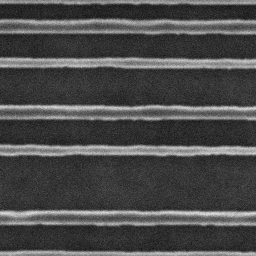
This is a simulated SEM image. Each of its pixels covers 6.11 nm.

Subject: lines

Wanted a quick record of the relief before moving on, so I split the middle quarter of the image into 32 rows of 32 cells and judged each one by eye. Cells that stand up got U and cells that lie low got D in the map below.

DDUUUUUUDDDDUUUUUUUUUUUUUUUUUUUU
DDDDDDDDDDDDDDDDDDDDDDDDDDDDDDDD
DDDDDDDDDDDDDDDDDDDDDDDDDDDDDDDD
DDDDDDDDDDDDDDDDDDDDDDDDDDDDDDDD
DDDDDDDDDDDDDDDDDDDDDDDDDDDDDDDD
DDDDDDDDDDDDDDDDDDDDDDDDDDDDDDDD
DDDDDDDDDDDDDDDDDDDDDDDDDDDDDDDD
DDDDDDDDDDDDDDDDDDDDDDDDDDDDDDDD
DDDDDDDDDDDDDDDDDDDDDDDDDDDDDDDD
DDDDDDDDDDDDDDDDDDDDDDDDDDDDDDDD
DDDDDDDDDDDDDDDDDDDDDDDDDDDDDDDD
UUUUUUUUUUUUUUUUUUUUUUUUUUUUUUUU
UUUUUUUUUUUUUUUUUUUUUUUUUUUUUUUU
UUUUUUUUUUUUUUUUUUUUUUUUUUUUUUUU
DDDDDDDDDDDDDDDDDDDDDDDDDDDDDDDD
DDDDDDDDDDDDDDDDDDDDDDDDDDDDDDDD
DDDDDDDDDDDDDDDDDDDDDDDDDDDDDDDD
DDDDDDDDDDDDDDDDDDDDDDDDDDDDDDDD
DDDDDDDDDDDDDDDDDDDDDDDDDDDDDDDD
DDDDDDDDDDDDDDDDDDDDDDDDDDDDDDDD
DDDDDDDDDDDDDDDDDDDDDDDDDDDDDDDD
UUUUUUUUUUUUUUUUUUUUUUUUUUUUUUUU
UUDDUUUUUUUUUUUUUUDUUUUUUUUUUUUU
DDDDDDDDDDDDDDDDDDDDDDDDDDDDDDDD
DDDDDDDDDDDDDDDDDDDDDDDDDDDDDDDD
DDDDDDDDDDDDDDDDDDDDDDDDDDDDDDDD
DDDDDDDDDDDDDDDDDDDDDDDDDDDDDDDD
DDDDDDDDDDDDDDDDDDDDDDDDDDDDDDDD
DDDDDDDDDDDDDDDDDDDDDDDDDDDDDDDD
DDDDDDDDDDDDDDDDDDDDDDDDDDDDDDDD
DDDDDDDDDDDDDDDDDDDDDDDDDDDDDDDD
DDDDDDDDDDDDDDDDDDDDDDDDDDDDDDDD